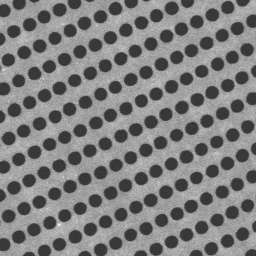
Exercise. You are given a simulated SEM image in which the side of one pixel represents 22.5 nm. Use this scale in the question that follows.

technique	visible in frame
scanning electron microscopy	a regular array of holes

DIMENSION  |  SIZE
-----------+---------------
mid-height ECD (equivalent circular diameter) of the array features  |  0.299 µm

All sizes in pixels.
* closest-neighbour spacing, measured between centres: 16.7